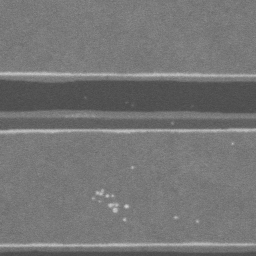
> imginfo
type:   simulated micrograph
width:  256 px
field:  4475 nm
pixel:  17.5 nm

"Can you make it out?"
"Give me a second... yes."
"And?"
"lines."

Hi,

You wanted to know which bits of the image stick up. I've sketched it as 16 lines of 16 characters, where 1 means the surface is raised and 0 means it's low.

1111111111111111
1111111111111111
1111111111111111
1111111111111111
1111111111111111
0000000000000000
0000000000000000
0000000000000000
1111111111111111
1111111111111111
1111111111111111
1111111111111111
1111111111111111
1111111111111111
1111111111111111
0000000000000000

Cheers